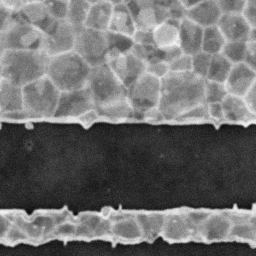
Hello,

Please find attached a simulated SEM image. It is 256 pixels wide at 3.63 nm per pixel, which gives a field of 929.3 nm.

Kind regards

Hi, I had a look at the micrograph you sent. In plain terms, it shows one or a few lines or trenches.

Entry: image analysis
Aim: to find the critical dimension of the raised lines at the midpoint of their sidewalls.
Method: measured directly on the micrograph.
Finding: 110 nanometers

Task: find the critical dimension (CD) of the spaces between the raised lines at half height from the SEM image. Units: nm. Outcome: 326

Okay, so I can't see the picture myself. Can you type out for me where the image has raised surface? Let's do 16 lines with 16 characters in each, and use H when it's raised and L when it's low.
HHHHHHHHHHHHHHHH
HHHHHHHHHHHHHHHH
HHHHHHHHHHHHHHHH
HHHHHHHHHHHHHHHH
HHHHHHHHHHHHHHHH
HHHHHHHHHHHHHHHH
HHHHHHHHHHHHHHHH
HHLLHHHHHHHHHHHH
LLLLLLLLLLLLLLLL
LLLLLLLLLLLLLLLL
LLLLLLLLLLLLLLLL
LLLLLLLLLLLLLLLL
LLLLLLLLLLLLLLLL
HHHHHHHHHHHHHHHH
HHHHHHHHHHHHHHHH
LLLLLLLLLLLLLLLL